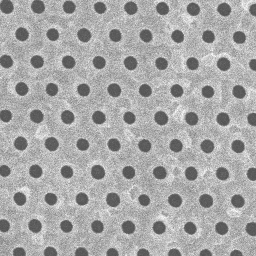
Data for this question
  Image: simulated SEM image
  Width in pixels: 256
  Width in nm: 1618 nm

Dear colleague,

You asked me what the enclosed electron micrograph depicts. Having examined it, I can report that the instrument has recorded a regular array of holes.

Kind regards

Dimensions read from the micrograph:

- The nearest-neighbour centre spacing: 30.8 px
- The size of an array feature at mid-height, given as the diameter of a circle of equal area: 83.7 nanometres